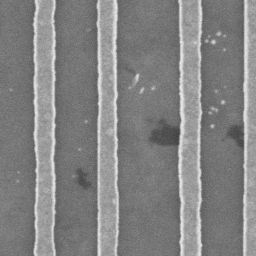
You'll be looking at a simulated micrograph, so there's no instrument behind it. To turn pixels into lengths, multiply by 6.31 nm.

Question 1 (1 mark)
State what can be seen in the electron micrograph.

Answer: lines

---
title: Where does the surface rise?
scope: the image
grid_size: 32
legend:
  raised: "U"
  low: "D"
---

DDDDDUUDDDDDUUDDDDDDDDDUUDDDDDDU
DDDDDUUDDDDDUUDDDDDDDDDUUDDDDDDU
DDDDUUUDDDDDUUDDDDDDDDDUUDDDDDDU
DDDDUUUDDDDDUUDDDDDDDDDUUDDDDDDU
DDDDUUUDDDDDUUDDDDDDDDDUUDDDDDDU
DDDDUUUDDDDDUUDDDDDDDDDUUDDDDDDU
DDDDUUUDDDDDUUDDDDDDDDDUUDDDDDDU
DDDDUUUDDDDDUUDDDDDDDDDUUDDDDDDU
DDDDUUUDDDDDUUDDDDDDDDDUUDDDDDDU
DDDDUUUDDDDDUUDDDDDDDDDUUDDDDDDU
DDDDUUUDDDDDUUDDDDDDDDDUUDDDDDDU
DDDDUUUDDDDDUUDDDDDDDDDUUDDDDDDU
DDDDUUUDDDDDUUDDDDDDDDDUUDDDDDDU
DDDDUUUDDDDDUUDDDDDDDDDUUDDDDDDU
DDDDDUUDDDDDUUDDDDDDDDDUUDDDDDDU
DDDDUUUDDDDDUUDDDDDDDDDUUDDDDDDU
DDDDUUUDDDDDUUDDDDDDDDDUUDDDDDDU
DDDDUUUDDDDDUUDDDDDDDDDUUDDDDDDU
DDDDDUUDDDDDUUDDDDDDDDDUUDDDDDDU
DDDDDUUDDDDDUUDDDDDDDDDUUDDDDDDU
DDDDDUUDDDDDUUUDDDDDDDUUUDDDDDDU
DDDDDUUDDDDDUUUDDDDDDDDUUDDDDDDU
DDDDDUUDDDDDUUUDDDDDDDDUUDDDDDDU
DDDDDUUDDDDDUUUDDDDDDDDUUDDDDDDU
DDDDDUUDDDDDUUUDDDDDDDDUUDDDDDDU
DDDDUUUDDDDDUUUDDDDDDDDUUDDDDDDU
DDDDUUUDDDDDUUUDDDDDDDDUUDDDDDDU
DDDDDUUDDDDDUUUDDDDDDDDUUDDDDDDU
DDDDDUUDDDDDUUUDDDDDDDDUUDDDDDDU
DDDDDUUDDDDDUUUDDDDDDDDUUDDDDDDU
DDDDUUUDDDDDUUUDDDDDDDDUUDDDDDDU
DDDDUUUDDDDDUUDDDDDDDDDUUDDDDDDU